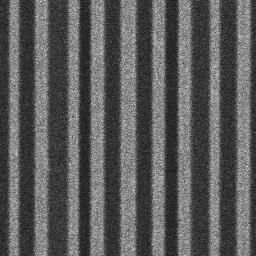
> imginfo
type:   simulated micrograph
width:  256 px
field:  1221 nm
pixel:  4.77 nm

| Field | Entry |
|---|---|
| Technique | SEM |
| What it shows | parallel lines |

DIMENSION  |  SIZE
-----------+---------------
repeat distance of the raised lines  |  0.137 microns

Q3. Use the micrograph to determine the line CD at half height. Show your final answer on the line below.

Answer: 69.8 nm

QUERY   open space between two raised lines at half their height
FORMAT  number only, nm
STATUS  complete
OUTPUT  74